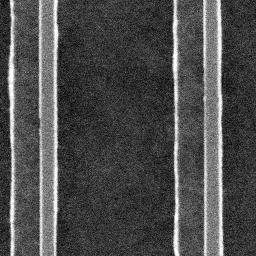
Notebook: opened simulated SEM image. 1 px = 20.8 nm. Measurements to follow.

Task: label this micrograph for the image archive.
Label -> lines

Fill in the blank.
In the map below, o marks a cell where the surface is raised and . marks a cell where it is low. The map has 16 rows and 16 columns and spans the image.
.oo........ooo..
.oo........ooo..
.oo........ooo..
.oo........ooo..
.oo........ooo..
.oo........ooo..
.oo........ooo..
.oo........ooo..
.oo........ooo..
.oo........ooo..
.oo........ooo..
.oo........ooo..
.oo........ooo..
.oo........ooo..
.oo........ooo..
.oo........ooo..